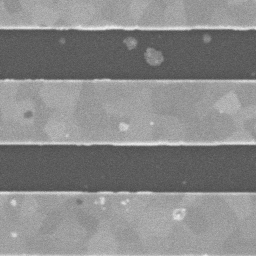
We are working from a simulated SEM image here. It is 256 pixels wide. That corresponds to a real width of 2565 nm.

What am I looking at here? lines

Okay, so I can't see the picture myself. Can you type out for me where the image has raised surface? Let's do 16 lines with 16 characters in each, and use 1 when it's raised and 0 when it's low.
1111111111111111
1111111111111111
0000000000000000
0000000000000000
0000000000000000
1111111111111111
1111111111111111
1111111111111111
1111111111111111
0000000000000000
0000000000000000
0000000000000000
1111111111111111
1111111111111111
1111111111111111
1111111111111111